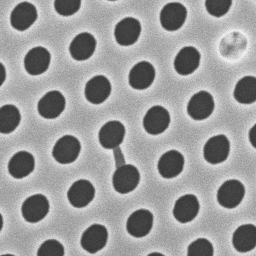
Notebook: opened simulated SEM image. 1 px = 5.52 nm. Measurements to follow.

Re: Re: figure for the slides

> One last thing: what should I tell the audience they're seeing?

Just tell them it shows a regular array of holes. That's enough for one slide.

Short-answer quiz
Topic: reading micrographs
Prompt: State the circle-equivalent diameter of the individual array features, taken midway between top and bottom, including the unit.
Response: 150 nm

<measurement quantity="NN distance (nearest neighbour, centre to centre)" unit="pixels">46.3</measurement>